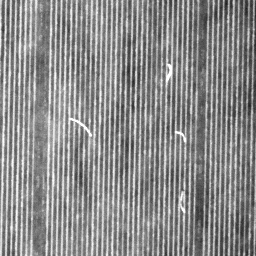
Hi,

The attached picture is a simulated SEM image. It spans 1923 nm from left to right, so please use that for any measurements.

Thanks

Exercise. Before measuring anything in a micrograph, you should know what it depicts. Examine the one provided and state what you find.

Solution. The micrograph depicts parallel lines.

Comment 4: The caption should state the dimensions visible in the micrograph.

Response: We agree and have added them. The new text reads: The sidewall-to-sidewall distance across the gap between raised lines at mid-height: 31 nm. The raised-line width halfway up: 6.6 nanometres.